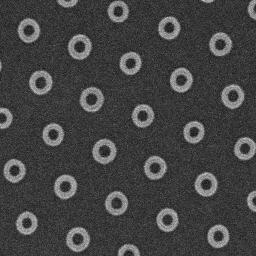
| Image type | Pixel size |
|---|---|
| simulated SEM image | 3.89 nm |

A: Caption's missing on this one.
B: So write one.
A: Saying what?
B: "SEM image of a regular array of ring-shaped raised bodies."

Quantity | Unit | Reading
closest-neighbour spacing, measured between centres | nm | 204